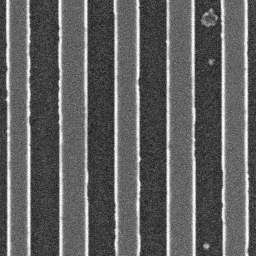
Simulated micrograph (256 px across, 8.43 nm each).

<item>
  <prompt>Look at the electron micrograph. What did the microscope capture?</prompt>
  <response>lines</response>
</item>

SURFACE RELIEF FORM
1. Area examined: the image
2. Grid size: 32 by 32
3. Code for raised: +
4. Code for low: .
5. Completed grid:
.+++...++++...+++....+++....+++.
.+++...++++...+++....+++....+++.
.+++...++++...+++....+++....+++.
.+++...++++...+++....+++....+++.
.+++....+++...+++....+++....+++.
.+++...++++...+++....+++....+++.
.+++...++++...+++....+++....+++.
.+++...++++...+++....+++....+++.
.+++...++++...+++....+++....+++.
.+++....+++...+++....+++....+++.
.+++...++++...+++....+++....+++.
.+++...++++...+++....+++....+++.
.+++...++++...+++....+++....+++.
.+++...++++...+++....+++....+++.
.+++...++++...+++....+++....+++.
.+++....+++...+++....+++....+++.
.+++....+++...+++....+++....+++.
.+++....+++...+++....+++....+++.
.+++....+++...+++....+++....+++.
.+++....+++...+++....+++....+++.
.+++....+++...+++....+++....+++.
.+++....+++...+++....+++....+++.
.+++....+++...+++....+++....+++.
.+++....+++...+++....+++....+++.
.+++....+++...+++....+++....+++.
.+++....+++....++....+++....+++.
.+++....+++....++....+++....+++.
.+++....+++....++....+++....+++.
.+++....+++....++....+++....+++.
.+++....+++....++....+++....+++.
.+++....+++...+++....+++....+++.
.+++....+++....++....+++....+++.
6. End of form